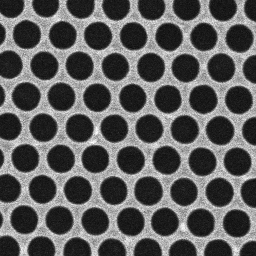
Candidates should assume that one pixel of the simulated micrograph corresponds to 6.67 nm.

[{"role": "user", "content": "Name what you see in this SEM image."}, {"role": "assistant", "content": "a regular array of holes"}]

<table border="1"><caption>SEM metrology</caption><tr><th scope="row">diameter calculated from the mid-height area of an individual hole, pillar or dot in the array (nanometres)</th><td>185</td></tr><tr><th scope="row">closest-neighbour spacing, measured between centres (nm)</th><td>234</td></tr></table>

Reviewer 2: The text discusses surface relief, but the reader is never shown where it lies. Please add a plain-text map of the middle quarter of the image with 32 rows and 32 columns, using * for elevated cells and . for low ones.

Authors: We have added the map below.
.......**.......**.......**.....
*......***......**.......**.....
*......***......***......**.....
**....*****....****.....****....
******************************.*
..****....*****....******..*****
..***......***......***......***
...**.......**......***......***
...**.......**.......*.......**.
...**......***......***......**.
..****.....***......***......***
.******...*****....*****....****
***.****************************
*.....****.....****....*****....
*......**.......**......***.....
.......**.......**.......**.....
.......**.......**.......**.....
*......***......**......***.....
*.....****.....****.....***.....
************.*******...******...
.******..*******.********.******
..***.....****.....****.....****
..***......***......**.......***
...*.......**.......**.......**.
...**......**.......**.......**.
..***......***......**.......**.
.*****....****.....****.....****
*****************.*******.******
**...******...*****....*********
*.....****.....***......****....
.......**.......**......***.....
.......**.......*........**.....